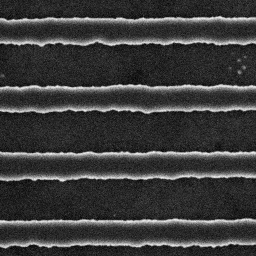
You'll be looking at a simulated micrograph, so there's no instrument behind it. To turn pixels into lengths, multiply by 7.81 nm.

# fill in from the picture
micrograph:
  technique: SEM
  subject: lines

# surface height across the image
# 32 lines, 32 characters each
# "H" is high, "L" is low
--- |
LLLLLLLLLLLLLLLLLLLLLLLLLLLLLLLL
LLLLLLLLLLLLLLLLLLLLLLLLLLLLLLLL
HHHHHHHHHHHHHHHHHHHHHHHHHHHHHHHH
HHHHHHHHHHHHHHHHHHHHHHHHHHHHHHHH
HHHHHHHHHHHHHHHHHHHHHHHHHHHHHHHH
LLHLHHLLHHHLLHHLHHLLHLLLLLLHHLHL
LLLLLLLLLLLLLLLLLLLLLLLLLLLLLLLL
LLLLLLLLLLLLLLLLLLLLLLLLLLLLLLLL
LLLLLLLLLLLLLLLLLLLLLLLLLLLLLLLL
LLLLLLLLLLLLLLLLLLLLLLLLLLLLLLLL
LLLLLLLLLLLLLLLLLLLLLLLLLLLLLLLL
HHHHHHHHHHHHHHHHHHHHHHHHHHHHHHHH
HHHHHHHHHHHHHHHHHHHHHHHHHHHHHHHH
HHHHHHHHHHHHHHHHHHHHHHHHHHHHHHHH
LLLLLLLLLLLLLLLLLLLLLLLLLLLLLLLL
LLLLLLLLLLLLLLLLLLLLLLLLLLLLLLLL
LLLLLLLLLLLLLLLLLLLLLLLLLLLLLLLL
LLLLLLLLLLLLLLLLLLLLLLLLLLLLLLLL
LLLLLLLLLLLLLLLLLLLLLLLLLLLLLLLL
HHHHHHHHHHHHHHHHHHHHHHHHHHHHHHHH
HHHHHHHHHHHHHHHHHHHHHHHHHHHHHHHH
HHHHHHHHHHHHHHHHHHHHHHHHHHHHHHHH
HLLLLLLHLLLLLLLLLLLLLLLLLLLLLLLL
LLLLLLLLLLLLLLLLLLLLLLLLLLLLLLLL
LLLLLLLLLLLLLLLLLLLLLLLLLLLLLLLL
LLLLLLLLLLLLLLLLLLLLLLLLLLLLLLLL
LLLLLLLLLLLLLLLLLLLLLLLLLLLLLLLL
LLLLLLLLLLLLLLLLLLLLLHHLLLLLLLHH
HHHHHHHHHHHHHHHHHHHHHHHHHHHHHHHH
HHHHHHHHHHHHHHHHHHHHHHHHHHHHHHHH
HHHHHHHHHHHHHHHHHHHHHHHHHHHHHHHH
LLLLLLLLLLLLLLLLLLLLLLLLLLLLLLLL